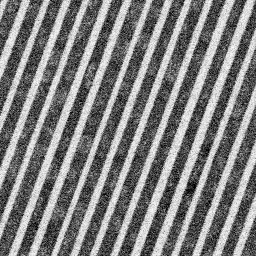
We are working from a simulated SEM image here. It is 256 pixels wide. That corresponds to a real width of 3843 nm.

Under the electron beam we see parallel lines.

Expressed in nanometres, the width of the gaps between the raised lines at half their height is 192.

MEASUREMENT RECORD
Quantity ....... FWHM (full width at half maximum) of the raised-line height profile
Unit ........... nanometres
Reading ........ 87.9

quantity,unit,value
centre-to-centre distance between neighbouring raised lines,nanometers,287